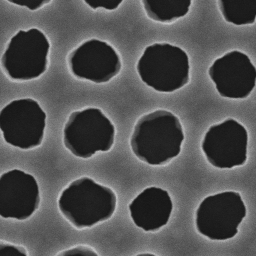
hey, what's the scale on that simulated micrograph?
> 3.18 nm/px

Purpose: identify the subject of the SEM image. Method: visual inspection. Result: a regular array of holes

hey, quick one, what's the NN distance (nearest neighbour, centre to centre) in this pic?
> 219 nm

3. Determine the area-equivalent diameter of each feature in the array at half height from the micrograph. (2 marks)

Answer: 152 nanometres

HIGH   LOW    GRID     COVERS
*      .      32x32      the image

**...******....***......****....
*******************....*****....
********************.*******....
********************************
**...***************************
*.....*****..*******************
*.....****....****.....******.**
*.....***......**......****....*
*.....***......**.......**......
*....*****....****......**......
******************.....****.....
***************************....*
**..****************************
*....***************************
......***....*****....**********
......***.....***......*****..**
.....***......***......***.....*
*....***......***......***.....*
*********.....**.......**......*
**********.******.....****.....*
*******************.******....**
*..*****************************
....******.*********************
.....***.....******.************
.....***......***....*****....**
.....**.......**.....****.....**
....****......**.....****......*
*********...*****....****.....**
******************..*****.....**
**************************...***
********************************
...******..*********************